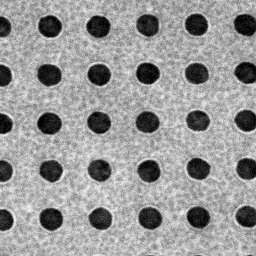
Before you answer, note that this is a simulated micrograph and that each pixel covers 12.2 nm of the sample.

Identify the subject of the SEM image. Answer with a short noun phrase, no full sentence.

a regular array of holes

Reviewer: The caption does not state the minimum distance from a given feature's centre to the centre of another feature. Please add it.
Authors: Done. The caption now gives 588 nanometres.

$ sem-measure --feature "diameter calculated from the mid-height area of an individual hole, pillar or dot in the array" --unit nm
302